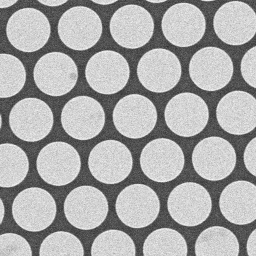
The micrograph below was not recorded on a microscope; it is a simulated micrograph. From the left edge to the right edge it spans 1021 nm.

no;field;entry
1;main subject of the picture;an array of small figures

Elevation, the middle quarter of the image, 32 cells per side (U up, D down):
UUUDDDUUUUUUUUUUDDUUUUUUUUUUUDDU
UUUDDUUUUUUUUUUUDDUUUUUUUUUUUDDU
UUUDDUUUUUUUUUUUDDDUUUUUUUUUUDDU
UUUDDDUUUUUUUUUUDDDUUUUUUUUUUDDD
UUUDDDUUUUUUUUUUDDDUUUUUUUUUDDDD
UUDDDDDUUUUUUUUDDDDDUUUUUUUUDDDD
UUDDDDDDUUUUUUDDDDDDDUUUUUDDDDDD
DDDDDDDDDDDDDDDDDDDDDDDDDDDDDUUU
DDDUUUUDDDDDDDDUUUUUUDDDDDDUUUUU
DUUUUUUUDDDDDDUUUUUUUUDDDDUUUUUU
UUUUUUUUUDDDDUUUUUUUUUUDDDUUUUUU
UUUUUUUUUUDDDUUUUUUUUUUDDUUUUUUU
UUUUUUUUUUDDUUUUUUUUUUUDDUUUUUUU
UUUUUUUUUUDDUUUUUUUUUUUDDUUUUUUU
UUUUUUUUUUDDUUUUUUUUUUUDDDUUUUUU
UUUUUUUUUUDDDUUUUUUUUUUDDDUUUUUU
UUUUUUUUUDDDDUUUUUUUUUDDDDDUUUUU
DUUUUUUUDDDDDDUUUUUUUDDDDDDDUUUU
DDDUUUUDDDDDDDDDDUDDDDDDDDDDDDDD
DDDDDDDDDUUUUUDDDDDDDDUUUUUDDDDD
UUDDDDDDUUUUUUUDDDDDUUUUUUUUUDDD
UUUDDDDUUUUUUUUUDDDDUUUUUUUUUDDD
UUUDDDUUUUUUUUUUUDDUUUUUUUUUUUDD
UUUUDDUUUUUUUUUUUDDUUUUUUUUUUUDD
UUUUDDUUUUUUUUUUUDDUUUUUUUUUUUDD
UUUUDDUUUUUUUUUUUDDUUUUUUUUUUUDD
UUUUDDDUUUUUUUUUUDDDUUUUUUUUUDDD
UUUDDDDUUUUUUUUUDDDDUUUUUUUUUDDD
UUUDDDDDUUUUUUUDDDDDDUUUUUUUDDDD
UUDDDDDDDUUUUUDDDDDDDDDDDDDDDDDD
DDDDDDDDDDDDDDDDUUUUDDDDDDDDUUUU
DDUUUUUUUDDDDDDUUUUUUUDDDDDUUUUU